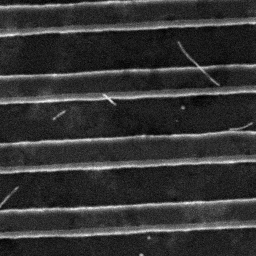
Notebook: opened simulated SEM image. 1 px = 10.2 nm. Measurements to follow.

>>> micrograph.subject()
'lines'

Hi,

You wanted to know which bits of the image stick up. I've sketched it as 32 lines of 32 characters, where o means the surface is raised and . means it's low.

..........oooooooooooooooooooooo
oooooooooooooooooooooooooooooooo
oooooooooooooooooooooooooooooooo
oooooooooooooooooooo............
................................
................................
................................
................................
........................oooooooo
..oooooooooooooooooooooooooooooo
oooooooooooooooooooooooooooooooo
oooooooooooooooooooooooooooooo..
ooooooo.........................
................................
................................
................................
................................
..........oooooooooooooooooooooo
oooooooooooooooooooooooooooooooo
oooooooooooooooooooooooooooooooo
oooooooooooooooooooooo..........
................................
................................
................................
................................
......................oooooooooo
oooooooooooooooooooooooooooooooo
oooooooooooooooooooooooooooooooo
ooooooooooooooooooooooooo.......
ooo.............................
................................
................................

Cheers